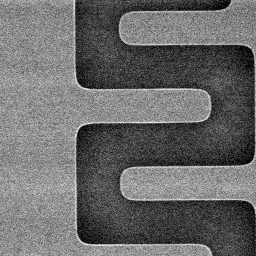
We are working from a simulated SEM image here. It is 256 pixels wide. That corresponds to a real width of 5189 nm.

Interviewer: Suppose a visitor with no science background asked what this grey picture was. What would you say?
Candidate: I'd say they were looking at groups of lines, slits or small figures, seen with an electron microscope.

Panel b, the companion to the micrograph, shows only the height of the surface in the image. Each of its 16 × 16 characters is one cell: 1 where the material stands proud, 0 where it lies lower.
1111100000000011
1111100011111111
1111100011111111
1111100000000000
1111100000000000
1111100000000000
1111111111111000
1111111111111000
1111100000000000
1111100000000000
1111100011111111
1111100011111111
1111100011110001
1111100000000000
1111100000000000
1111111111111000